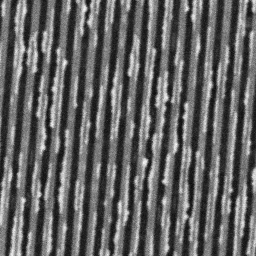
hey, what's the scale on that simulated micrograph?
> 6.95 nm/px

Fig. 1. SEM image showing parallel lines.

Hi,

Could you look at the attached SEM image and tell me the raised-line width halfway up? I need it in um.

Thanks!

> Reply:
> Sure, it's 0.0502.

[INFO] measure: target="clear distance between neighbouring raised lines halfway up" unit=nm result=49.3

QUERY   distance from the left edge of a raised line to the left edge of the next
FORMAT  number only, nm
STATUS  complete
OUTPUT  102